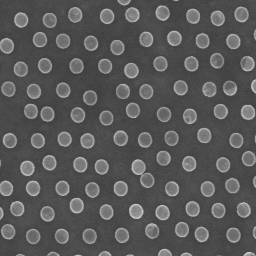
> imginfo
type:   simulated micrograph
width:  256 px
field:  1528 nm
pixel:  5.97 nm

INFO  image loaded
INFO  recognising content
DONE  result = a regular array of raised bodies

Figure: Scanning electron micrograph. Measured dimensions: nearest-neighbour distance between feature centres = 146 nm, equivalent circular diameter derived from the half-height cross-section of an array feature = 84.1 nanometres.